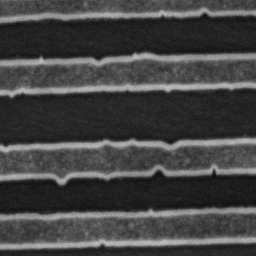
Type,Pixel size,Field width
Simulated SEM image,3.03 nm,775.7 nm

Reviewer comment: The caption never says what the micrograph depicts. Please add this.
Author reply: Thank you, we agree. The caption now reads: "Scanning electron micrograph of one or a few lines or trenches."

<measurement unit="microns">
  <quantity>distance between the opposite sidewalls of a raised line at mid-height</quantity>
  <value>0.0913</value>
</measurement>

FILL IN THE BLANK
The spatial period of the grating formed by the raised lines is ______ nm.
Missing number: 234